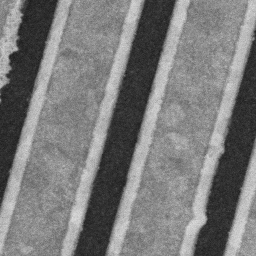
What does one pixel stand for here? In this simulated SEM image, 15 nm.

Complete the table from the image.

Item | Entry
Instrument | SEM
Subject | one or a few lines or trenches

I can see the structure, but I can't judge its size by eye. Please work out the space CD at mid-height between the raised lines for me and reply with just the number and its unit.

692 nm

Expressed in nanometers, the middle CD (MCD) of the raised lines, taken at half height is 1020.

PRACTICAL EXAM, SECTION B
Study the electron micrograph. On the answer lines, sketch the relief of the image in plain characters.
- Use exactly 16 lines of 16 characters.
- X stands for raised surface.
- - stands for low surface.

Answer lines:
X---XXXX---XXXXX
X---XXXX---XXXXX
X--XXXXX---XXXX-
---XXXXX---XXXX-
---XXXX---XXXXX-
---XXXX---XXXX--
--XXXXX---XXXX--
--XXXX---XXXXX--
--XXXX---XXXXX--
-XXXXX---XXXX---
-XXXXX---XXXX---
-XXXX---XXXXX---
-XXXX---XXXX---X
XXXXX---XXXX---X
XXXX---XXXXX---X
XXXX---XXXXX---X